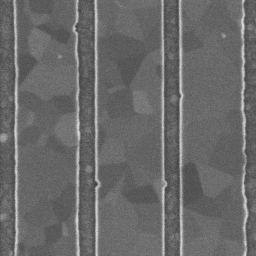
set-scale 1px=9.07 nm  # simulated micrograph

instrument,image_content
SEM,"one or a few lines or trenches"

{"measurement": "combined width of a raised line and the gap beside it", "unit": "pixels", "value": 82.8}